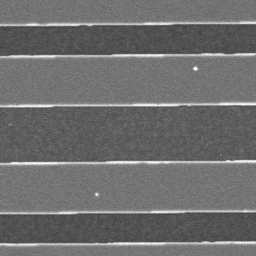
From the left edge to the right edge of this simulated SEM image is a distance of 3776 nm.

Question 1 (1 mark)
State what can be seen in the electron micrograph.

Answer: lines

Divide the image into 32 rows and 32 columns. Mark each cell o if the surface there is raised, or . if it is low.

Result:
oooooooooooooooooooooooooooooooo
oooooooooooooooooooooooooooooooo
oooooooooooooooooooooooooooooooo
................................
................................
................................
................................
oooooooooooooooooooooooooooooooo
oooooooooooooooooooooooooooooooo
oooooooooooooooooooooooooooooooo
oooooooooooooooooooooooooooooooo
oooooooooooooooooooooooooooooooo
oooooooooooooooooooooooooooooooo
................................
................................
................................
................................
................................
................................
................................
oooooooooooooooooooooooooooooooo
oooooooooooooooooooooooooooooooo
oooooooooooooooooooooooooooooooo
oooooooooooooooooooooooooooooooo
oooooooooooooooooooooooooooooooo
oooooooooooooooooooooooooooooooo
oooooooooooooooooooooo..........
................................
................................
................................
..............oooooooooooooooooo
oooooooooooooooooooooooooooooooo